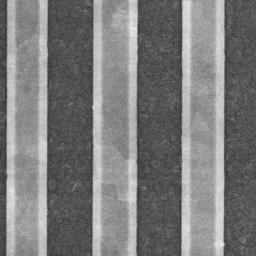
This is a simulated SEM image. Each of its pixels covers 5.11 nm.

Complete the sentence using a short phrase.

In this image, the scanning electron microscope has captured one or a few lines or trenches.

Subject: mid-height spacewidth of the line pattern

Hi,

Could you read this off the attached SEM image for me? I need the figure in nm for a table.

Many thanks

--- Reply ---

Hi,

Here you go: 271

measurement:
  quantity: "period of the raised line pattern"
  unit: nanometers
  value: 450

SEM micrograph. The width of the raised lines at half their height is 176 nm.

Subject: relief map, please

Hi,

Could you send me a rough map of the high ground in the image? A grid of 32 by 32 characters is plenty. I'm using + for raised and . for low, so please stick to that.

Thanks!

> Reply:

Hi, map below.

.++++.......+++++......+++++....
.++++.......+++++......+++++....
.++++.......+++++......+++++....
.++++.......+++++......+++++....
.++++.......+++++......+++++....
.++++.......+++++......+++++....
.++++.......+++++......++++.....
.++++.......+++++......++++.....
.++++.......+++++......++++.....
.++++.......+++++......++++.....
.++++.......+++++......++++.....
.++++.......+++++......++++.....
.++++.......+++++......++++.....
.++++.......+++++......++++.....
.++++.......+++++......++++.....
.++++.......+++++......+++++....
.++++.......+++++......++++.....
.++++.......+++++......++++.....
.++++.......+++++......++++.....
.++++.......+++++......++++.....
.++++.......+++++......++++.....
.++++.......+++++......++++.....
.++++.......+++++......++++.....
.++++.......+++++......++++.....
.++++.......+++++......++++.....
.++++.......+++++......++++.....
.++++.......+++++......++++.....
.++++.......+++++......++++.....
.++++.......+++++......++++.....
.++++.......+++++......++++.....
.++++.......+++++......+++++....
.++++.......+++++......++++.....